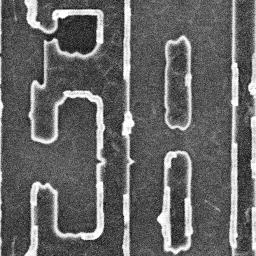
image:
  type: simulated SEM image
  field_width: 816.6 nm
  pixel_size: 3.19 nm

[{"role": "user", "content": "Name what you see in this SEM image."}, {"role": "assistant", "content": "one or a few lines or trenches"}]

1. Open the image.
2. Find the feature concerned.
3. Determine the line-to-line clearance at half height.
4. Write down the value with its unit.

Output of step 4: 119 nm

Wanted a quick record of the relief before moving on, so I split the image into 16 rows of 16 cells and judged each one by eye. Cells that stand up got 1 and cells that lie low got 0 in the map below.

0011111100000001
0011001100000001
0000001100000001
0001111100110001
0001111100110001
0011111100110001
0011001100110001
0011001100110001
0010001100000001
0000001100000001
0000001100110011
0000001100110011
0010001100110011
0010001100110011
0011001100110011
0011111100000011